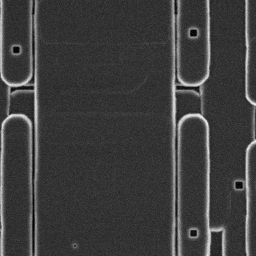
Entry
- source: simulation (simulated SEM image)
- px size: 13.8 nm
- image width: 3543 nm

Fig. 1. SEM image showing wiring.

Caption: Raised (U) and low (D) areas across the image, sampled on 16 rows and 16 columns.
UUUUUUUUUUUUUDDU
UUUUUUUUUUUUUDDU
UUUUUUUUUUUUUDDU
UUUUUUUUUUUUUDDU
UUUUUUUUUUUUUDDU
DDUUUUUUUUUDDDDU
DDUUUUUUUUUDDDDD
UUUUUUUUUUUUUDDD
UUUUUUUUUUUUUDDD
UUUUUUUUUUUUUDDU
UUUUUUUUUUUUUDDU
UUUUUUUUUUUUUDDU
UUUUUUUUUUUUUDDU
UUUUUUUUUUUUUDDU
UUUUUUUUUUUUUDDU
UUUUUUUUUUUUUDDU